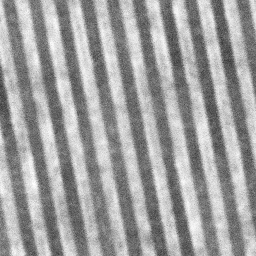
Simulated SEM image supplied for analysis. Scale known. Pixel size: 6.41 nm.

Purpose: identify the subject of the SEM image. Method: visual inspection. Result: parallel lines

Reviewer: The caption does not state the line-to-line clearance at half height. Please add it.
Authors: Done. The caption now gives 89.7 nm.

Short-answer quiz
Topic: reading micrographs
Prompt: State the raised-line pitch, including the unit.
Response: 164 nm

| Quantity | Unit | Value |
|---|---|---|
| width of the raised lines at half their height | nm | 78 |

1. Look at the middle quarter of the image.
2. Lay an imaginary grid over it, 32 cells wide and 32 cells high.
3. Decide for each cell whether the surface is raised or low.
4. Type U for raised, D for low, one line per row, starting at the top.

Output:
DDDDUUUDDDDUUUDDDUUUDDDUUUUDDDUU
UDDDUUUDDDDUUUDDDUUUDDDDUUUDDDUU
UDDDDUUDDDDUUUDDDDUUDDDDUUUDDDDU
UDDDDUUDDDDUUUDDDDUUUDDDUUUDDDDU
UDDDDUUUDDDUUUDDDDUUUDDDUUUDDDDU
UDDDDUUUDDDDUUUDDDUUUDDDUUUDDDDU
UUDDDUUUDDDDUUUDDDUUUDDDDUUUDDDU
UUDDDUUUDDDDUUUDDDDUUDDDDUUUDDDD
UUDDDDUUDDDDUUUDDDDUUUDDDUUUDDDD
UUDDDDUUUDDDDUUDDDDUUUDDDUUUDDDD
UUDDDDUUUDDDDUUUDDDUUUDDDUUUDDDD
UUUDDDUUUDDDDUUUDDDUUUDDDDUUUDDD
UUUDDDUUUDDDDUUUDDDDUUDDDDUUUDDD
UUUDDDDUUDDDDUUUDDDDUUUDDDUUUDDD
UUUDDDDUUUDDDDUUDDDDUUUDDDUUUDDD
UUUDDDDUUUDDDDUUDDDDUUUDDDUUUDDD
DUUUDDDUUUDDDDUUUDDDUUUDDDDUUUDD
DUUUDDDUUUDDDDUUUDDDDUUDDDDUUUDD
DUUUDDDUUUDDDDUUUDDDDUUUDDDUUUDD
DUUUDDDDUUUDDDUUUDDDDUUUDDDUUUDD
DUUUDDDDUUUDDDDUUDDDDUUUDDDUUUDD
DDUUUDDDUUUDDDDUUUDDDUUUDDDDUUUD
DDUUUDDDUUUDDDDUUUDDDDUUDDDDUUUD
DDUUUDDDDUUDDDDUUUDDDDUUDDDDUUUD
DDUUUDDDDUUUDDDUUUDDDDUUUDDDUUUD
DDUUUDDDDUUUDDDUUUDDDDUUUDDDUUUD
DDDUUDDDDUUUDDDDUUUDDDUUUDDDDUUD
DDDUUUDDDUUUDDDDUUUDDDUUUDDDDUUU
DDDUUUDDDDUUDDDDUUUDDDDUUDDDDUUU
DDDUUUDDDDUUDDDDUUUDDDDUUUDDDUUU
DDDUUUDDDDUUUDDDUUUDDDDUUUDDDUUU
DDDDUUDDDDUUUDDDDUUUDDDUUUDDDUUU